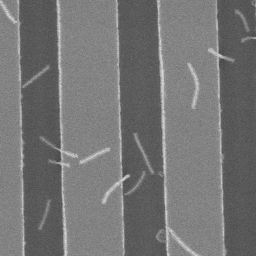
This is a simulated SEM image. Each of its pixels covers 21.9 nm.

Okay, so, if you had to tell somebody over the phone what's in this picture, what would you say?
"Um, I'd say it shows lines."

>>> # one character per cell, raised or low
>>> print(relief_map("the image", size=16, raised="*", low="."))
*...***...****..
*...***...****..
*...***...****..
*...***...****..
*...***...****..
*...***...****..
*...****..****..
*...****..****..
*...****..****..
*...****..****..
*...****..****..
*...****..****..
*...****..****..
*...****..****..
*...****..****..
*...****..****..